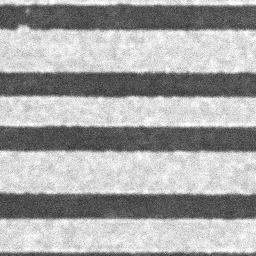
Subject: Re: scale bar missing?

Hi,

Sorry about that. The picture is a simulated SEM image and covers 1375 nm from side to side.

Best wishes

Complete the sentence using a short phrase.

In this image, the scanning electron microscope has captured lines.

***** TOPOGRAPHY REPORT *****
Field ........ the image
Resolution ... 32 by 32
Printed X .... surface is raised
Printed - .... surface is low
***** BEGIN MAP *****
--------------------------------
--------------------------------
--------------------------------
--------------------------------
XXXXXXXXXXXXXXXXXXXXXXXXXXXXXXXX
XXXXXXXXXXXXXXXXXXXXXXXXXXXXXXXX
XXXXXXXXXXXXXXXXXXXXXXXXXXXXXXXX
XXXXXXXXXXXXXXXXXXXXXXXXXXXXXXXX
XXXXXXXXXXXXXXXXXXXXXXXXXXXXXXXX
--------------------------------
--------------------------------
--------------------------------
XXXXXXXXXXXXXXXXXXXXXXXXXXXXXXXX
XXXXXXXXXXXXXXXXXXXXXXXXXXXXXXXX
XXXXXXXXXXXXXXXXXXXXXXXXXXXXXXXX
XXXXXXXXXXXXXXXXXXXXXXXXXXXXXXXX
--------------------------------
--------------------------------
--------------------------------
XXXXXXXXXXXXXXXXXXXXXXXXXXXXXXXX
XXXXXXXXXXXXXXXXXXXXXXXXXXXXXXXX
XXXXXXXXXXXXXXXXXXXXXXXXXXXXXXXX
XXXXXXXXXXXXXXXXXXXXXXXXXXXXXXXX
XXXXXXXXXXXXXXXXXXXXXXXXXXXXXXXX
--------------------------------
--------------------------------
--------------------------------
---X----------------------------
XXXXXXXXXXXXXXXXXXXXXXXXXXXXXXXX
XXXXXXXXXXXXXXXXXXXXXXXXXXXXXXXX
XXXXXXXXXXXXXXXXXXXXXXXXXXXXXXXX
-----------------------X--X-XXXX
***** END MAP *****